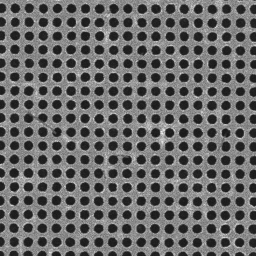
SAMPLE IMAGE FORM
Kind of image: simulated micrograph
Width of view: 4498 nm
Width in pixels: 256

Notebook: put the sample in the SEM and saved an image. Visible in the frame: a regular array of holes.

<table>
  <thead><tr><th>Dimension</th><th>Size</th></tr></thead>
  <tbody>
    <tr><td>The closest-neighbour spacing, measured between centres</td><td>236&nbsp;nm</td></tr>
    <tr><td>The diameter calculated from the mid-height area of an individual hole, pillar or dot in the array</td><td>0.168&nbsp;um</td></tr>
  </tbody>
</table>